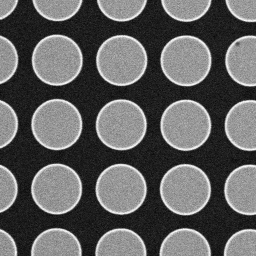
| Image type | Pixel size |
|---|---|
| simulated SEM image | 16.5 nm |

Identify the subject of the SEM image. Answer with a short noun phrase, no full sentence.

an array of small figures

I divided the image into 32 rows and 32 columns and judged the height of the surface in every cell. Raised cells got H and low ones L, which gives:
HHLLHHHHHHLLHHHHHHLLHHHHHHLLHHHH
HLLLLHHHHHLLLHHHHHLLLHHHHHLLLHHH
LLLLLLHHLLLLLLHHLLLLLLHHLLLLLLHH
LLLLLLLLLLLLLLLLLLLLLLLLLLLLLLLL
LLLLLLHHLLLLLLHHLLLLLLLHLLLLLLLL
HLLLLHHHHHLLLHHHHHLLLHHHHHLLLHHH
HHLLHHHHHHLLHHHHHHLLHHHHHHLLHHHH
HHLLHHHHHHLLHHHHHHLLHHHHHHLLHHHH
HHLLHHHHHHLLHHHHHHLLHHHHHHLLHHHH
HLLLLHHHHHLLLHHHHHLLLHHHHHLLLHHH
LLLLLLHHLLLLLLHHLLLLLLHHLLLLLLHH
LLLLLLLLLLLLLLLLLLLLLLLLLLLLLLLL
LLLLLLHHLLLLLLHHLLLLLLLLLLLLLLLL
HLLLLHHHHLLLLHHHHLLLLHHHHLLLLHHH
HHLLHHHHHHLLHHHHHHLLHHHHHHLLHHHH
HHLLHHHHHHLLHHHHHHLLHHHHHHLLHHHH
HHLLHHHHHHLLHHHHHHLLHHHHHHLLHHHH
HLLLLHHHHHLLLHHHHHLLLHHHHHLLLHHH
LLLLLLHHLLLLLLHHLLLLLLHHHLLLLLHH
LLLLLLLLLLLLLLLLLLLLLLLLLLLLLLLL
LLLLLLLHLLLLLLLLLLLLLLLLLLLLLLLL
HLLLLHHHHLLLLHHHHLLLLHHHHLLLLHHH
HHLLHHHHHHLLHHHHHHLLHHHHHHLLHHHH
HHLLHHHHHHLLHHHHHHLLHHHHHHLLHHHH
HHLLHHHHHHLLHHHHHHLLHHHHHHLLHHHH
HHLLLHHHHHLLLHHHHHLLLHHHHHLLLHHH
LLLLLLHHLLLLLLHHLLLLLLHHHLLLLLHH
LLLLLLLLLLLLLLLLLLLLLLLLLLLLLLLL
LLLLLLLLLLLLLLLLLLLLLLLLLLLLLLLL
HLLLLHHHHLLLLHHHHLLLLHHHHLLLLHHH
HHLLHHHHHHLLHHHHHHLLHHHHHHLLHHHH
HHLLHHHHHHLLHHHHHHLLHHHHHHLLHHHH